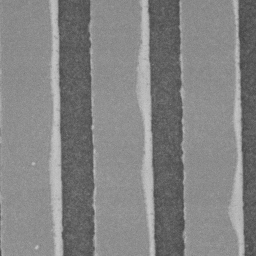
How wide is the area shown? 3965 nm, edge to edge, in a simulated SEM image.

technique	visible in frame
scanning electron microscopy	lines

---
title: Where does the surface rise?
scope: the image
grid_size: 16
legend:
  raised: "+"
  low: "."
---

+++...+++..++++.
++++..+++..++++.
++++..+++..++++.
++++..+++..++++.
++++..+++..++++.
++++..+++..++++.
++++..+++..++++.
++++..+++..++++.
++++..+++..++++.
++++..+++..++++.
++++..+++..++++.
++++..+++..++++.
++++..+++...+++.
++++..+++...+++.
++++..++++..+++.
++++..++++..+++.